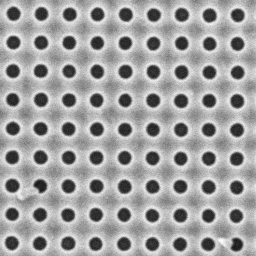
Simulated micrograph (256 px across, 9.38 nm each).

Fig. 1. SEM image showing a regular array of holes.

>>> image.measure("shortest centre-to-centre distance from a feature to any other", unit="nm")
262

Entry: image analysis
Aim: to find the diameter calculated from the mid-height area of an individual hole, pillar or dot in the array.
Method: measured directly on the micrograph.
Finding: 14.9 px